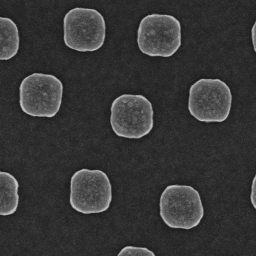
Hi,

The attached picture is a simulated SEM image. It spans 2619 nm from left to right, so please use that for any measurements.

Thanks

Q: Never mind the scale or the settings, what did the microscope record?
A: raised bodies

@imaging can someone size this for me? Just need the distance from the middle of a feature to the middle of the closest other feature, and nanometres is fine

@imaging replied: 818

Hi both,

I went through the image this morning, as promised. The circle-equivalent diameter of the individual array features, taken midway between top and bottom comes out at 0.445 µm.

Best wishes